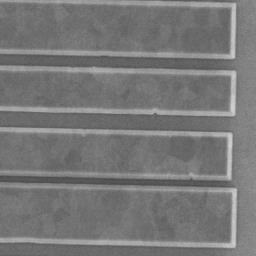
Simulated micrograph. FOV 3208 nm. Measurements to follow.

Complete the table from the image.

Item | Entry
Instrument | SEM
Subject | one or a few lines or trenches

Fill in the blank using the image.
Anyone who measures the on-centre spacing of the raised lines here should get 780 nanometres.